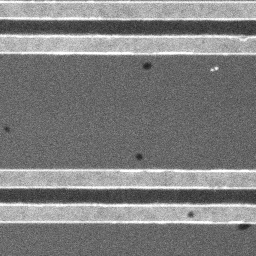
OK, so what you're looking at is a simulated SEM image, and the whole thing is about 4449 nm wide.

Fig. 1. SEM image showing lines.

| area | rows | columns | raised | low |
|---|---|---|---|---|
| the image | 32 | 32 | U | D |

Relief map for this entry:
DDDDDDDDDDDDDDDDDDDDDDDDDDDDDDDD
DDDDDDDDDDDDDDDDDDDDDDDDDDDDDDDD
UUUUUUUUUUUUUUUUUUUUUUUUUUUDDDUU
UUUUUUUUUUUUUUUUUUUUUUUUUUUUUUUU
DDDDDDDDDDDDDDDDDDDDDDDDDDDDDDUU
DDDDDDDDDDDDDDDDDDDDDDDDDDDDDDDD
DDDDDDDDDDDDDDDDDDDDDDDDDDDDDDDD
UUUUUUUUUUUUUUUUUUUUUUUUUUUUUUUU
UUUUUUUUUUUUUUUUUUUUUUUUUUUUUUUU
UUUUUUUUUUUUUUUUUUUUUUUUUUUUUUUU
UUUUUUUUUUUUUUUUUUUUUUUUUUUUUUUU
UUUUUUUUUUUUUUUUUUUUUUUUUUUUUUUU
UUUUUUUUUUUUUUUUUUUUUUUUUUUUUUUU
UUUUUUUUUUUUUUUUUUUUUUUUUUUUUUUU
UUUUUUUUUUUUUUUUUUUUUUUUUUUUUUUU
UUUUUUUUUUUUUUUUUUUUUUUUUUUUUUUU
UUUUUUUUUUUUUUUUUUUUUUUUUUUUUUUU
UUUUUUUUUUUUUUUUUUUUUUUUUUUUUUUU
UUUUUUUUUUUUUUUUUUUUUUUUUUUUUUUU
UUUUUUUUUUUUUUUUUUUUUUUUUUUUUUUU
UUUUUUUUUUUUUUUUUUUUUUUUUUUUUUUU
DDDDDDDDDDDDDDDDDDDDDDDDDDDDDDDD
DDDDDDDDDDDDDDDDDDDDDDDDDDDDDDDD
UUUUUUUUUUDDDDUUUDDDDDDDDDDDDDDD
UUUUUUUUUUUUUUUUUUUUUUUUUUUUUUUU
DDDDDDDDDDDDUUUUUUUDUDDUUUUUDDUU
DDDDDDDDDDDDDDDDDDDDDDDDDDDDDDDD
DDDDDDDDDDDDDDDDDDDDDDDDDDDDDDDD
UUUUUUUUUUUUUUUUUUUUUUUUUUUUUUUU
UUUUUUUUUUUUUUUUUUUUUUUUUUUUUUUU
UUUUUUUUUUUUUUUUUUUUUUUUUUUUUUUU
UUUUUUUUUUUUUUUUUUUUUUUUUUUUUUUU